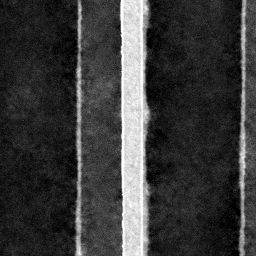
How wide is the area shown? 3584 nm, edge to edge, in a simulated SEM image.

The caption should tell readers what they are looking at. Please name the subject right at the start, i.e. lines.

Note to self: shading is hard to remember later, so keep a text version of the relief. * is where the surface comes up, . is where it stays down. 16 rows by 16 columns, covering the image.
.....****......*
.....****......*
.....****......*
.....****......*
.....****......*
.....****......*
.....****......*
.....****......*
.....****......*
.....****......*
.....****......*
.....****......*
.....****......*
.....****......*
.....****......*
.....****......*